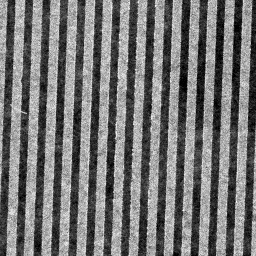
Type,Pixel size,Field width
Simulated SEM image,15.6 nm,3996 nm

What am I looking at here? parallel lines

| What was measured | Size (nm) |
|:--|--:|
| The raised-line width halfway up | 135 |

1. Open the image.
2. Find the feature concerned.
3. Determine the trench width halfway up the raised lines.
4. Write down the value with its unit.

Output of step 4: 133 nanometres